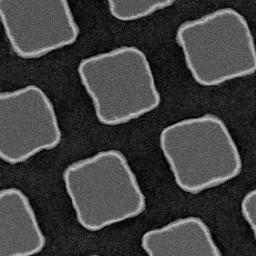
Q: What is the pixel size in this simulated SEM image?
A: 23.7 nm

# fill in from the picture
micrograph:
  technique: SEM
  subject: raised bodies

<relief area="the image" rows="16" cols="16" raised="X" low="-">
XXXX---XXX------
XXXXX-------XXX-
-XXX-------XXXXX
------XXX---XXXX
-----XXXX---XXXX
-----XXXXX------
XXX---XXXX------
XXX---XX----XX--
XXXX------XXXX--
XX--------XXXXX-
----XXXX---XXXX-
----XXXXX--XX---
XX--XXXXX------X
XX---XXX-------X
XX-------XXXX---
XX-------XXXX---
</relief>